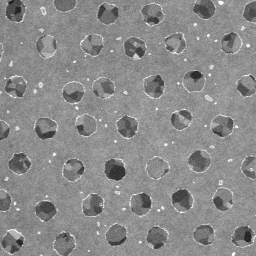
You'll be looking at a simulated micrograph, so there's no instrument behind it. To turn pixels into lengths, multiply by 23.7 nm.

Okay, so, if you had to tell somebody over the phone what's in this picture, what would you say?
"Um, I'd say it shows a regular array of raised bodies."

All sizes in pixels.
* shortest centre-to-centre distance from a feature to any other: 40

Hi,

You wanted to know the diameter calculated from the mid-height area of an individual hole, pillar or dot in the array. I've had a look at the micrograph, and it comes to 521 nanometres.